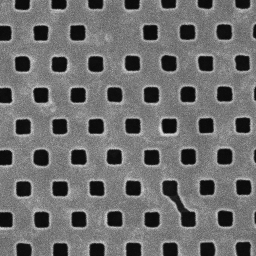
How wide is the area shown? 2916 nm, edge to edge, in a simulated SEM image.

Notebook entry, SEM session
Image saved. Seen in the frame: a regular array of holes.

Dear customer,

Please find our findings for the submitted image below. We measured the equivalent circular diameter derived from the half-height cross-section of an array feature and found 191 nm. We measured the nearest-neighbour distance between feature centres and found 408 nanometres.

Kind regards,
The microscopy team